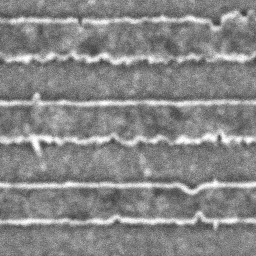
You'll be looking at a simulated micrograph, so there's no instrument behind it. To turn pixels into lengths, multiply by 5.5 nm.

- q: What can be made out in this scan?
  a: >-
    one or a few lines or trenches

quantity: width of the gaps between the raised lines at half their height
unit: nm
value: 246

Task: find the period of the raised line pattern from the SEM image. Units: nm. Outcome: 451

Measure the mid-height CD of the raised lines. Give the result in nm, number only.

202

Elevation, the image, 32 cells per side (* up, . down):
................................
................................
...............*.*****.**...****
********************************
********************************
********************************
********************************
.**..*.....*..***.***.*.........
................................
................................
................................
................................
....*...........................
********************************
********************************
********************************
********************************
***....*.**.*..**.**.****...*..*
................................
................................
................................
................................
................................
***********************..*******
********************************
********************************
********************************
**************..********..******
................................
................................
................................
................................